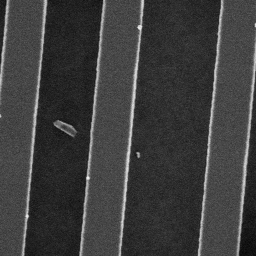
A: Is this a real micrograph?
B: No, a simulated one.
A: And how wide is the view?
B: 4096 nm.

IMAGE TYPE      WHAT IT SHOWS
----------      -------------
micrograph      lines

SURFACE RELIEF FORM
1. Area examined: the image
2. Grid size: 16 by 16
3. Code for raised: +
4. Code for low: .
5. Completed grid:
+++...+++.....++
+++...+++.....++
+++...+++.....++
+++...+++.....++
+++...+++....+++
++....++.....+++
++....++.....+++
++....++.....+++
++....++.....+++
++....++.....++.
++...+++.....++.
++...+++.....++.
++...+++.....++.
++...+++.....++.
++...+++.....++.
++...+++....+++.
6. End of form